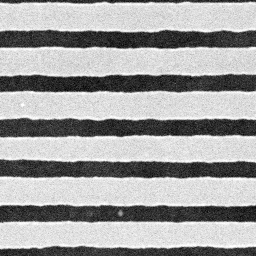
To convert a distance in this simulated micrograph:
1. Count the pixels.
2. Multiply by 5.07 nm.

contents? lines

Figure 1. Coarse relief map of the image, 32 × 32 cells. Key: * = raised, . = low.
*.*******..*********************
********************************
********************************
********************************
................................
................................
********************************
********************************
********************************
.......**...*...................
................................
..***.......**....***...********
********************************
********************************
********************************
................................
................................
********************************
********************************
********************************
................................
................................
********************************
********************************
********************************
********************************
................................
................................
********************************
********************************
********************************
................................